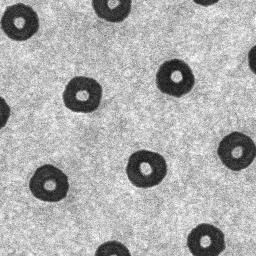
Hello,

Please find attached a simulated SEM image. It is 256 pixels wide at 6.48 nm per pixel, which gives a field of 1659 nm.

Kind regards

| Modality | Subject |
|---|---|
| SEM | ring-shaped grooves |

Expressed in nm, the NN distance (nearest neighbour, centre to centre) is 612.